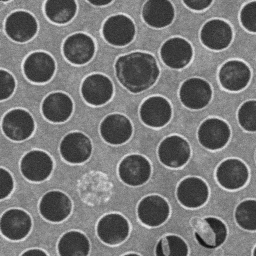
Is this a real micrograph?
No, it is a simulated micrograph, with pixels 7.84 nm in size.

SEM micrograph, a regular array of holes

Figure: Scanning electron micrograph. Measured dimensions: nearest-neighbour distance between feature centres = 341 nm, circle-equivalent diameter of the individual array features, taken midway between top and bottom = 0.259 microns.